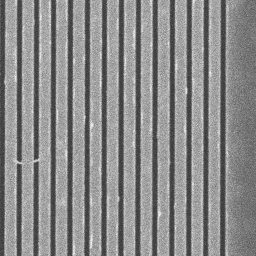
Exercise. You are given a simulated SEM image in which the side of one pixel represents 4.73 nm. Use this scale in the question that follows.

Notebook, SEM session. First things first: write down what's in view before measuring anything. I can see parallel lines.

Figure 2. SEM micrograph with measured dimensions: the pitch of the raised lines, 0.0803 microns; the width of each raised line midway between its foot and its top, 57.4 nm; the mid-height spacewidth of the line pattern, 0.026 um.